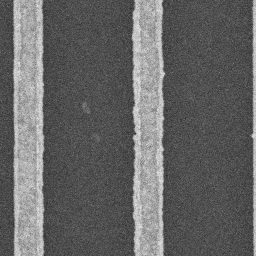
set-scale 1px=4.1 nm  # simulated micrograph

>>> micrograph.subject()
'one or a few lines or trenches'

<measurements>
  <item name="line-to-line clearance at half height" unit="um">0.388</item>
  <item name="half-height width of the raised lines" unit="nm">104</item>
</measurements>